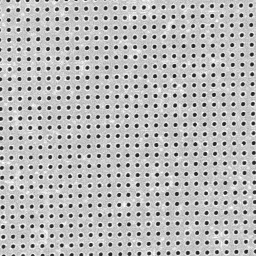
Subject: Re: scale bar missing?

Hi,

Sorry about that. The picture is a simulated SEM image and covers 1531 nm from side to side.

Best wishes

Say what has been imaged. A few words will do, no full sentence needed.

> a regular array of holes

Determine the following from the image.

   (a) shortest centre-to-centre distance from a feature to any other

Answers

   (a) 0.0564 micrometres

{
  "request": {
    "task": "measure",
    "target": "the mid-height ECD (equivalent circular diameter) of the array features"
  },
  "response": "0.0253 µm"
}